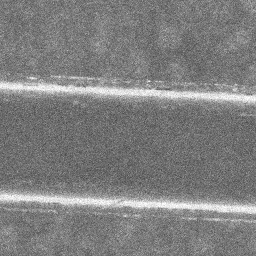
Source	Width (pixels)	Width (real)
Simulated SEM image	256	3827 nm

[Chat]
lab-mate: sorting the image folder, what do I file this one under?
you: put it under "one or a few lines or trenches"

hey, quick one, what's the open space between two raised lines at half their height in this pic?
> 1660 nm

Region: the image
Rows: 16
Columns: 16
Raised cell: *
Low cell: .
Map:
****************
****************
****************
****************
****************
...*************
................
................
................
................
................
................
***.............
****************
****************
****************